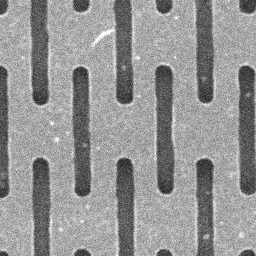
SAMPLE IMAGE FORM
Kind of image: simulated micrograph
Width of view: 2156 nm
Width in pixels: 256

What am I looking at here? holes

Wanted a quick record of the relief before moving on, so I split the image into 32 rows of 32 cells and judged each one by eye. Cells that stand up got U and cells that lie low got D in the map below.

DUUUDDUUUDDUUUDDUUUDDDUUDDDUUUDD
DUUUDDUUUUDUUUDDDUUUDUUUDDDUUUDD
UUUUDDUUUUUUUUDDDUUUUUUUDDDUUUUU
UUUUDDUUUUUUUUDDDUUUUUUUDDDUUUUU
UUUUDDUUUUUUUUDDDUUUUUUUDDDUUUUU
UUUUDDUUUUUUUUDDDUUUUUUUUDDUUUUU
UUUUDDUUUUUUUUDDDUUUUUUUUDDUUUUU
UUUUDDUUUUUUUUDDDUUUUUUUDDDUUUUU
DUUUDDUUUDDUUUDDDUUUDUUUDDDUUUDD
DUUUDDUUUDDUUUUDDUUDDDUUDDDUUUDD
DUUUDDUUUDDUUUUDDUUDDDUUDDDUUUDD
DUUUDDUUUDDUUUDDDUUDDDUUUDDUUUDD
DUUUDDUUUDDUUUUDDUUDDDUUUDUUUUDD
DUUUUUUUUDDUUUUUUUUDDDUUUUUUUUDD
DUUUUUUUUDDUUUUUUUUDDDUUUUUUUUDD
DUUUUUUUUDDUUUUUUUUDDDUUUUUUUUDD
DUUUUUUUUDDUUUUUUUUDDDUUUUUUUUDD
DUUUUUUUUDDUUUUUUUUDDDUUUUUUUUDD
DUUUUUUUUDDUUUUUUUUDDDUUUUUUUUDD
DUUUUUUUUDDUUUUUUUUDDDUUUUUUUUDD
DUUUDDUUUDDUUUUDDUUUDDUUUDDUUUDD
DUUUDDUUUDDUUUDDDUUUDDUUDDDUUUDD
DUUUDDUUUDDUUUDDDUUUDDUUUDDUUUDD
DUUUDDUUUDDUUUDDDUUUDDUUDDDUUUDD
DUUUDDUUUUDUUUUDDUUUUUUUDDDUUUUU
UUUUDDUUUUUUUUUDDUUUUUUUUDDUUUUU
UUUUDDUUUUUUUUUDDUUUUUUUUDDUUUUU
UUUUDDUUUUUUUUUDDUUUUUUUDDDUUUUU
UUUUDDUUUUUUUUUDDUUUUUUUUDDUUUUU
UUUUDDUUUUUUUUUDDUUUUUUUUDDUUUUU
UUUUDDUUUUUUUUUDDUUUUUUUUDDUUUUU
DUUUDDUUUDDUUUUDDUUUDUUUUDDUUUDD